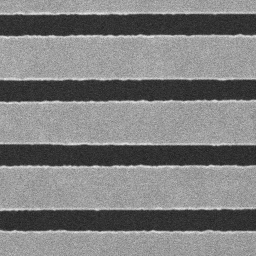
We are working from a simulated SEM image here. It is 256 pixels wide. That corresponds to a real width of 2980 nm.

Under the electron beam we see lines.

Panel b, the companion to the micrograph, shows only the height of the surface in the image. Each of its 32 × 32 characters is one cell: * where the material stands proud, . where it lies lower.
********************************
********************************
................................
................................
...**.*.************************
********************************
********************************
********************************
********************************
********************************
................................
................................
................................
********************************
********************************
********************************
********************************
********************************
................................
................................
................................
********************************
********************************
********************************
********************************
********************************
................................
................................
................................
********************************
********************************
********************************